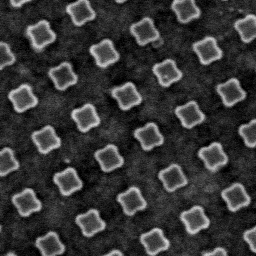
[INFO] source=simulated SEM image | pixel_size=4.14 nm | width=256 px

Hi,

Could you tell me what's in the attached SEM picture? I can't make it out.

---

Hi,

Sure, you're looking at a regular array of raised bodies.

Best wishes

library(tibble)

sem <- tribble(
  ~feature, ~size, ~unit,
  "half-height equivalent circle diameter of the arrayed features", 103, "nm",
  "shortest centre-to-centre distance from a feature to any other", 191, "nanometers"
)